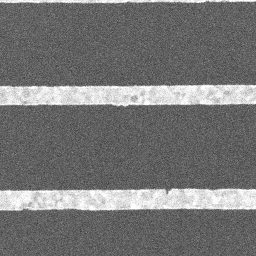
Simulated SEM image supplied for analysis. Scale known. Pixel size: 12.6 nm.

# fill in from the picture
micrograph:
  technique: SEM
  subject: one or a few lines or trenches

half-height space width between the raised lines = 1.06 µm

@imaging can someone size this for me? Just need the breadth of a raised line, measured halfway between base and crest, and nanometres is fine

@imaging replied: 229